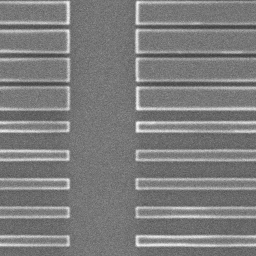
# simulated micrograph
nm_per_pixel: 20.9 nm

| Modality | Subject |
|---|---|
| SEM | groups of lines, slits or small figures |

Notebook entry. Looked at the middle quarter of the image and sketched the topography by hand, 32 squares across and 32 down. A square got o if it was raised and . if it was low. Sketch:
o.................oooooooooooooo
o.................oooooooooooooo
o.................oooooooooooooo
o.................oooooooooooooo
................................
................................
o.................oooooooooooooo
o.................oooooooooooooo
o.................oooooooooooooo
o.................oooooooooooooo
o.................oooooooooooooo
................................
................................
................................
................................
o.................oooooooooooooo
o.................oooooooooooooo
................................
................................
................................
................................
................................
o.................oooooooooooooo
o.................oooooooooooooo
................................
................................
................................
................................
................................
o.................oooooooooooooo
o.................oooooooooooooo
................................